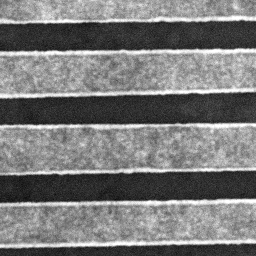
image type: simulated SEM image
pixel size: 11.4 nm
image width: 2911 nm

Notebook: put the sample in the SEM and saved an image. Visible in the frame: lines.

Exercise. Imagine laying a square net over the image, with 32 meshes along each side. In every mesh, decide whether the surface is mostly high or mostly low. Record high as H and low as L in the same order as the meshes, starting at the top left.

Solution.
HHHHHHHHHHHHHHHHHHHHHHHHHHHHHHHH
HHHHHHHHHHHHHHHHHHHHHHHHHHHHHHHH
HHHHHHHHHHHHHHHHHHHHHHHHHHHHHLLH
LLLLLLLLLLLLLLLLLLLLLLLLLLLLLLLL
LLLLLLLLLLLLLLLLLLLLLLLLLLLLLLLL
LLLLLLLLLLLLLLLLLLLLLLLLLLLLLLLL
LLLLLLHLHHHHHHHHHHHHHHHHHHHHHHHH
HHHHHHHHHHHHHHHHHHHHHHHHHHHHHHHH
HHHHHHHHHHHHHHHHHHHHHHHHHHHHHHHH
HHHHHHHHHHHHHHHHHHHHHHHHHHHHHHHH
HHHHHHHHHHHHHHHHHHHHHHHHHHHHHHHH
HHHHHHHHHHHHHHHHHHHHHHHHHHHHLLLL
LLLLLLLLLLLLLLLLLLLLLLLLLLLLLLLL
LLLLLLLLLLLLLLLLLLLLLLLLLLLLLLLL
LLLLLLLLLLLLLLLLLLLLLLLLLLLLLLLL
LLLLLLLLLLLLLLLLLLLLLLHLLLLLLHHH
HHHHHHHHHHHHHHHHHHHHHHHHHHHHHHHH
HHHHHHHHHHHHHHHHHHHHHHHHHHHHHHHH
HHHHHHHHHHHHHHHHHHHHHHHHHHHHHHHH
HHHHHHHHHHHHHHHHHHHHHHHHHHHHHHHH
HHHHHHHHHHHHHHHHHHHHHHHHHHHHHHHH
HHHHHHHHHHHHHHHLLLLLLLLLLLLLLLLL
LLLLLLLLLLLLLLLLLLLLLLLLLLLLLLLL
LLLLLLLLLLLLLLLLLLLLLLLLLLLLLLLL
LLLLLLLLLLLLLLLLLLLLLLLLLLLLLLLL
HHHHHHHHHHHHHHHHHHHHHHHHHHHHHHHH
HHHHHHHHHHHHHHHHHHHHHHHHHHHHHHHH
HHHHHHHHHHHHHHHHHHHHHHHHHHHHHHHH
HHHHHHHHHHHHHHHHHHHHHHHHHHHHHHHH
HHHHHHHHHHHHHHHHHHHHHHHHHHHHHHHH
HHHHHHHHHHHHHHHHHHHHLLLLLLLLLLLL
LLLLLLLLLLLLLLLLLLLLLLLLLLLLLLLL